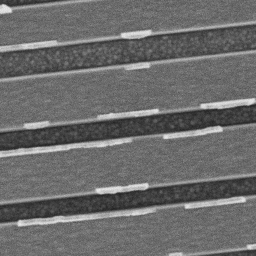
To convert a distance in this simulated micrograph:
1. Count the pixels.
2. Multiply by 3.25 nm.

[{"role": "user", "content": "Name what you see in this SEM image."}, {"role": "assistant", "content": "one or a few lines or trenches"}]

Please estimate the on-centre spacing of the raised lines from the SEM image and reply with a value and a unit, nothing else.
236 nm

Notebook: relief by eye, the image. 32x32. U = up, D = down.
DDDDDDUUUUUUUUUUUUUUUUUUUUUUUUUU
UUUUUUUUUUUUUUUUUUUUUUUUUUUUUUUU
UUUUUUUUUUUUUUUUUUUUUUUUUUUUUUUU
UUUUUUUUUUUUUUUUUUUUUUUUUUUDDDDD
UUUUUUUUUUUUUUUUUUDDDDDDDDDDDDDD
UUUUUUUUUDDDDDDDDDDDDDDDDDDDDDDD
DDDDDDDDDDDDDDDDDDDDDDDDDDDDDDDU
DDDDDDDDDDDDDDDDDDDDDDUUUUUUUUUU
DDDDDDDDDDDDDUUUUUUUUUUUUUUUUUUU
DDDDUUUUUUUUUUUUUUUUUUUUUUUUUUUU
UUUUUUUUUUUUUUUUUUUUUUUUUUUUUUUU
UUUUUUUUUUUUUUUUUUUUUUUUUUUUUUUU
UUUUUUUUUUUUUUUUUUUUUUUUUUUUUUUU
UUUUUUUUUUUUUUUUUUUUUUUUUUUUDDDD
UUUUUUUUUUUUUUUUUDDDDDDDDDDDDDDD
UUUUUUUUDDDDDDDDDDDDDDDDDDDDDDDD
DDDDDDDDDDDDDDDDDDDDDDDUUUUUUUUU
DDDDDDDDDDDDDDUUUUUUUUUUUUUUUUUU
DDDDUUUUUUUUUUUUUUUUUUUUUUUUUUUU
UUUUUUUUUUUUUUUUUUUUUUUUUUUUUUUU
UUUUUUUUUUUUUUUUUUUUUUUUUUUUUUUU
UUUUUUUUUUUUUUUUUUUUUUUUUUUUUUUU
UUUUUUUUUUUUUUUUUUUUUUUUUUUDDDDD
UUUUUUUUUUUUUUUUUUUDDDDDDDDDDDDD
UUUUUUUUUDDDDDDDDDDDDDDDDDDDDDDD
DDDDDDDDDDDDDDDDDDDDDDDUUUUUUUUU
DDDDDDDDDDDDDDUUUUUUUUUUUUUUUUUU
DDDUUUUUUUUUUUUUUUUUUUUUUUUUUUUU
UUUUUUUUUUUUUUUUUUUUUUUUUUUUUUUU
UUUUUUUUUUUUUUUUUUUUUUUUUUUUUUUU
UUUUUUUUUUUUUUUUUUUUUUUUUUUUUUUU
UUUUUUUUUUUUUUUUUUUUUUUUUUUUUDDD